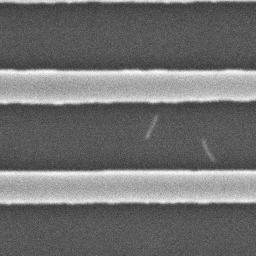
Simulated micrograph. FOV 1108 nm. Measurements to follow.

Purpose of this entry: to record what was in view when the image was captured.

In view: lines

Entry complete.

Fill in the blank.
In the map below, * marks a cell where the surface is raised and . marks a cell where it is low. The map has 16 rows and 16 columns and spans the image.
................
................
................
................
****************
****************
................
................
................
................
................
****************
****************
................
................
................